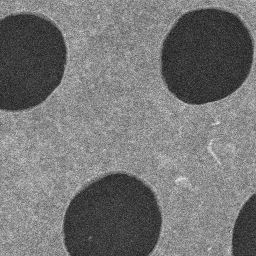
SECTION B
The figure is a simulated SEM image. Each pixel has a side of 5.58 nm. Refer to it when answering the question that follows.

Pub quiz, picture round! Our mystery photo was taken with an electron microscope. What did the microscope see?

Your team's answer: holes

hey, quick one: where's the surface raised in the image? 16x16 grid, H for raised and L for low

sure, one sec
HHHHHHHHHHHHHHHH
LLLHHHHHHHHLLLLH
LLLLHHHHHHLLLLLL
LLLLHHHHHHLLLLLL
LLLLHHHHHHLLLLLL
LLLLHHHHHHLLLLLH
LLHHHHHHHHHHLHHH
HHHHHHHHHHHHHHHH
HHHHHHHHHHHHHHHH
HHHHHHHHHHHHHHHH
HHHHHHHHHHHHHHHH
HHHHHLLLLHHHHHHH
HHHHHLLLLLHHHHHL
HHHHLLLLLLHHHHHL
HHHHLLLLLLHHHHHL
HHHHLLLLLLHHHHLL